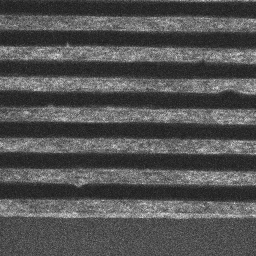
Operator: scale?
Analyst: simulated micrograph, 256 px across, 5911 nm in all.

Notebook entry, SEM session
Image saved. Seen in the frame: parallel lines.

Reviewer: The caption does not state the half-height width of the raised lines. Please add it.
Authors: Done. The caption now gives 378 nanometers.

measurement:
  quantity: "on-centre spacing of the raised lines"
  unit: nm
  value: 706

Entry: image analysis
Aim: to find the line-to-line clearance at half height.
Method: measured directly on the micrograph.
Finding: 338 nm